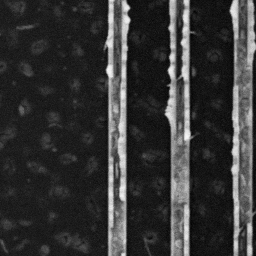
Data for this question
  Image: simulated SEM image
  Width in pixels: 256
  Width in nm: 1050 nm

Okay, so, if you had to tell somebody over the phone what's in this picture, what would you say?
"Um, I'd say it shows one or a few lines or trenches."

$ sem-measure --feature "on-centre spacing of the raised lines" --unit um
0.257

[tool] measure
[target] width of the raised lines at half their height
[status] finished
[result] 76.4 nanometers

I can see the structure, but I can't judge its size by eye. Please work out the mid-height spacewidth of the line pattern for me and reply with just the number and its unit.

182 nanometres